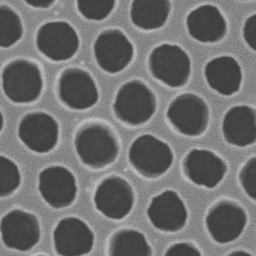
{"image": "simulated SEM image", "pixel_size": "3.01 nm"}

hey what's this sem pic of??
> a regular array of holes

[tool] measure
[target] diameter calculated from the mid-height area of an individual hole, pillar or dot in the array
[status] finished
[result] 119 nanometres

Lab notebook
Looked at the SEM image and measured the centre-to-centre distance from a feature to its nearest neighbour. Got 161 nanometres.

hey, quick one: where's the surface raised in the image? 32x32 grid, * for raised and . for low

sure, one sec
****..****....***....***********
..********....**.....***...*****
...*************.....**.....***.
...**....*********..****....**..
...**.....**....********....***.
..***.....**....***************.
*****....***.....**....*********
*******.****....***.....**...***
*....********..****.....**....**
.....***...********.....**....**
.....***....****..***..***....**
*....***....***....********..***
*...****....**.....***...*******
*********..***.....**.....***..*
***...*********....**.....**....
**.....***************....**....
**.....***....*********..***....
***....**.....***...********....
****..***......*.....***********
**********.....*......**...*****
..*********...***....**.....***.
..***....*********...**.....**..
..***....****...********....**..
..***.....**....***************.
.****....***.....***..*********.
******...***....***....*****.***
*..**********...**.....***.....*
.....***..*********....***.....*
.....**....*********...***....**
.....**.....**....*********...**
*...***.....**.....***.*********
*******....***.....**....****..*